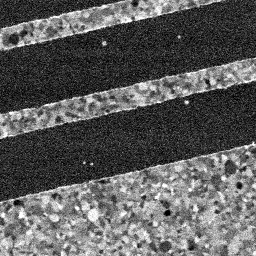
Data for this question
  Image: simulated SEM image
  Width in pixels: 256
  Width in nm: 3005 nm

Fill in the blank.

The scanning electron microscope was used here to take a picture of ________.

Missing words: one or a few lines or trenches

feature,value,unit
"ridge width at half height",21.7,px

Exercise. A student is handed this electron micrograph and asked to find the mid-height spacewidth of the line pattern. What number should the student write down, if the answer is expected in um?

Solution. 0.736